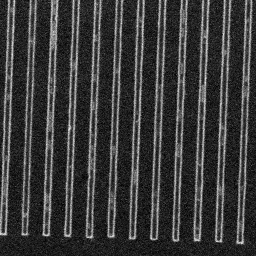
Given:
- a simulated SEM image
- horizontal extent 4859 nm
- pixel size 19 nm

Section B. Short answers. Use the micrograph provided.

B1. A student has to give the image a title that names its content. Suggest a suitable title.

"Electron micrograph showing parallel lines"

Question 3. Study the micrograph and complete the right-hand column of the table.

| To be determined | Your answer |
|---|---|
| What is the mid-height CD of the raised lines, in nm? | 109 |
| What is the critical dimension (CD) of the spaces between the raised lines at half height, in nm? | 306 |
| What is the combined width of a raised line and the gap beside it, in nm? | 409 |